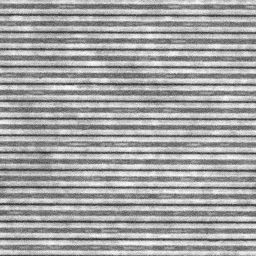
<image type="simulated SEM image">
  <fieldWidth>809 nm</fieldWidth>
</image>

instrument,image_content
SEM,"parallel lines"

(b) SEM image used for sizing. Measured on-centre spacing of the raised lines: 27.1 nanometres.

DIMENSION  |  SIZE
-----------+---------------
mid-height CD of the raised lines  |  13.4 nm